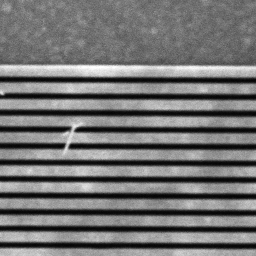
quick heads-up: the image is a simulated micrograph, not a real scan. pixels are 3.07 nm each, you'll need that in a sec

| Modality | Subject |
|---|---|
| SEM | parallel lines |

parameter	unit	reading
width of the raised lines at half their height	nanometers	34.2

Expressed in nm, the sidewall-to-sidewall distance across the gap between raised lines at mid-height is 18.4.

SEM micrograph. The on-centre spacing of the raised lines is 0.0508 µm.